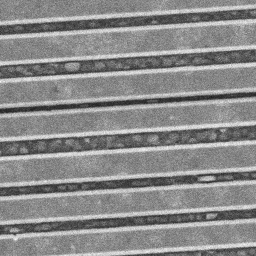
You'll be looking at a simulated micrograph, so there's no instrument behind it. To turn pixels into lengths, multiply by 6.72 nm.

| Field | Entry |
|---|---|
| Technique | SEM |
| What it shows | parallel lines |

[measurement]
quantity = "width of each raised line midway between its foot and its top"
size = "173 nm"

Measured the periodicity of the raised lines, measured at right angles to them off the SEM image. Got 267 nanometers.